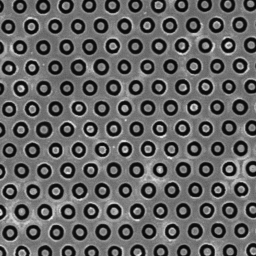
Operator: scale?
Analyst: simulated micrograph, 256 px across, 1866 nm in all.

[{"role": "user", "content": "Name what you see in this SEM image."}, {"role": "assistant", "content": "a regular array of ring-shaped grooves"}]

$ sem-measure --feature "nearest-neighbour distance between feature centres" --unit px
22.9